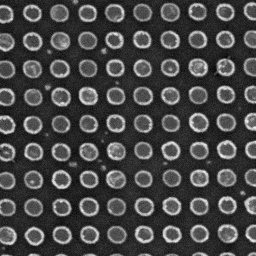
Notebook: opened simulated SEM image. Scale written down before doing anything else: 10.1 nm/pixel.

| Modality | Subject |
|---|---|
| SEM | a regular array of raised bodies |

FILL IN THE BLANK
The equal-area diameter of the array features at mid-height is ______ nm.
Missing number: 174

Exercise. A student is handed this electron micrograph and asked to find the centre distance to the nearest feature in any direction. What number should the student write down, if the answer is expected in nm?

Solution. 276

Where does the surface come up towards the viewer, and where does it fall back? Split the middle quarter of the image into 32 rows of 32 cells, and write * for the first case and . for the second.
*...****...****...****...****..*
*...****...****...****...****...
*....***....**....***....***....
................................
................................
................................
....****....**....***....***....
*...****...****...****...****..*
*...****...****...****...****...
*....***...****...***....***....
................................
................................
................................
.....**....****...***....***....
*...****...****...****...****...
*...****...****...****...****...
*....***....**.....**.....**....
................................
................................
................................
*...***....****...***....***....
*...****...****...****...****...
**..****...****...****...****...
*....***....***.....*.....**....
................................
................................
................................
*....***...****...***....***....
**..****...****...****...****...
**..****...****...****...****...
*....**.....***....**...........
................................